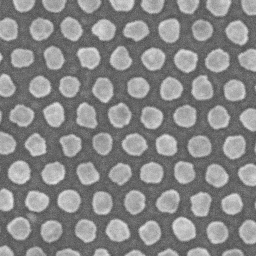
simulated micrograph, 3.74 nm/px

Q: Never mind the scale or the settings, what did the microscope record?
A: a regular array of raised bodies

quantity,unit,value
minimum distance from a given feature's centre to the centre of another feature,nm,118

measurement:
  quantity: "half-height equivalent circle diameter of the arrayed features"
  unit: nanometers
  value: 78.7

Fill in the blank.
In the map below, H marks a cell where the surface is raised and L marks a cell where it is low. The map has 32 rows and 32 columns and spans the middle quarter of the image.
LLLLLHHHLLLLHHHHLLLLHHHHLLLLHHHH
LLLLLLLLLLLLLLLLLLLLLLHLLLLLLLHH
LLLLLLLLLLLLLLLLLLLLLLLLLLLLLLLL
HHHLLLLLLLLLLLLLLLHHLLLLLLHLLLLL
HHHHLLLLHHHHLLLLHHHHHLLLLHHHHLLL
HHHHLLLHHHHHLLLLHHHHHLLLHHHHHLLL
HHHLLLLHHHHHLLLLHHHHHLLLHHHHHHLL
HHHLLLLHHHHHLLLLLHHHHLLLHHHHHLLL
LLLLLLLLLHHHLLLLLLLLLLLLLHHHLLLL
LLLLLLLLLLHLLLLLLLLLLLLLLLLLLLLL
LLLLHHHLLLLLLHHHLLLLLLLLLLLLLLHL
LLLHHHHLLLLHHHHHLLLLHHHLLLLLHHHH
LLLHHHHHLLLHHHHHHLLLHHHHLLLLHHHH
LLLHHHHHLLLHHHHHHLLHHHHHHLLLHHHH
LLLHHHHHLLLLHHHHLLLLHHHHLLLLHHHH
LLLLLHHHLLLLLHHLLLLLHHHHLLLLLHHH
LLLLLLLLLLLLLLLLLLLLLLLLLLLLLLLL
LLLLLLLLLHHLLLLLLLLLLLLLLLLLLLLL
HHHHLLLLHHHHLLLLHHHHLLLLHHHLLLLL
HHHHLLLHHHHHLLLHHHHHLLLHHHHHLLLH
HHHHLLLLHHHHLLLHHHHHHLLHHHHHLLLH
HHHHLLLLHHHHLLLHHHHHLLLHHHHHLLLH
HHHLLLLLLHLLLLLLLHHLLLLLLHHLLLLL
LLLLLLLLLLLLLLLLLLLLLLLLLLLLLLLL
LLLLLLLLLLLLLLLLLLLLLLLLLLLLLLLL
LLLLHHHLLLLLLHHHLLLLHHHHLLLLHHHH
LLLHHHHHLLLLHHHHHLLHHHHHHLLLHHHH
LLLHHHHHLLLHHHHHHLLHHHHHHLLLHHHH
LLLLHHHHLLLLHHHHLLLHHHHHHLLLHHHH
LLLLHHHLLLLLLHHLLLLLLHHHLLLLLHHH
LLLLLLLLLLLLLLLLLLLLLLLLLLLLLLLL
LLLLLLLLLLLLLLLLLLLLLLLLLLLLLLLL